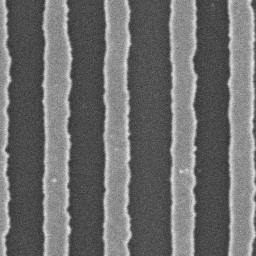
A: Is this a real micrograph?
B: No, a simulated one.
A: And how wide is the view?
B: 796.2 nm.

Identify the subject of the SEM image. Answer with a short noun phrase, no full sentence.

lines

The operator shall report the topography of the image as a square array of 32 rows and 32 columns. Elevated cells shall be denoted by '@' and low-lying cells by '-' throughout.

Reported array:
@-----@@-----@@@-----@@@-----@@-
@-----@@-----@@@-----@@@-----@@@
@----@@@-----@@@-----@@@-----@@@
@----@@@-----@@@-----@@@-----@@@
@-----@@-----@@@-----@@@-----@@@
@-----@@@----@@@-----@@@-----@@@
@-----@@@----@@@-----@@@-----@@@
@-----@@@----@@@-----@@@-----@@@
@-----@@@----@@@------@@-----@@@
@-----@@@----@@@-----@@@-----@@@
@----@@@@----@@@------@@-----@@@
@-----@@@----@@@-----@@@-----@@@
@----@@@-----@@@-----@@@-----@@@
@-----@@@----@@@-----@@@-----@@@
@-----@@@----@@@------@@-----@@@
@-----@@-----@@@------@@-----@@@
@-----@@-----@@@------@@-----@@@
@-----@@@----@@@------@@-----@@@
@-----@@@----@@@-----@@@-----@@@
@-----@@@----@@@-----@@@-----@@@
@-----@@-----@@@------@@-----@@@
@-----@@@----@@@-----@@@-----@@@
@----@@@@----@@@-----@@@-----@@@
@----@@@-----@@@-----@@@-----@@@
@-----@@@----@@@-----@@@-----@@@
@----@@@@----@@@-----@@@-----@@@
@-----@@-----@@@-----@@@-----@@@
@-----@@@----@@@-----@@@-----@@@
@----@@@@----@@@-----@@@-----@@@
@-----@@@----@@@-----@@@-----@@@
@-----@@@----@@@------@@-----@@@
@-----@@-----@@@------@@-----@@-